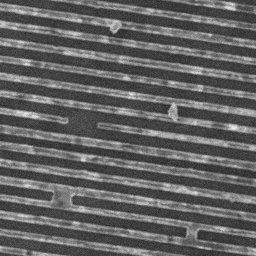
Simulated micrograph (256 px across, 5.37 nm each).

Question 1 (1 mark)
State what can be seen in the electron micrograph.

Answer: parallel lines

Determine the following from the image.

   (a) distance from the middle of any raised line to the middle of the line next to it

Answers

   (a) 92 nanometers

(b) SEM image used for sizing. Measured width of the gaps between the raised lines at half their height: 0.0598 microns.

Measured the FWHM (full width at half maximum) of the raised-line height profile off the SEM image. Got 32.5 nanometers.